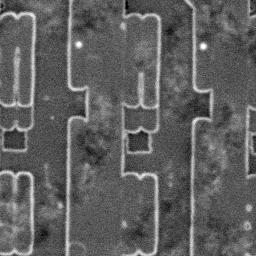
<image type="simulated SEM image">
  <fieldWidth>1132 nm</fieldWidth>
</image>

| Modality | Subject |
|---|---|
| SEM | wiring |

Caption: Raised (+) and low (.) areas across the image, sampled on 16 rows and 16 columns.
....++++....++++
++..++++++..++++
++..++++++..++++
++..++++++..++++
++..++++++..++++
++...+++++..++++
++...+++++...+++
.....+++....++++
....++++....+++.
....++++....+++.
....++++....++++
++..++++++..++++
++..++++++..++++
++..++++++..++++
++..++++++..++++
++..++++++..++++